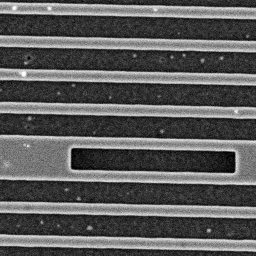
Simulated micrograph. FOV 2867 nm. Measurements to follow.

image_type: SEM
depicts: groups of lines, slits or small figures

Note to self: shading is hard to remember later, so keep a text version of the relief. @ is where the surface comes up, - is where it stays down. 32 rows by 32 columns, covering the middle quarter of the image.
--------------------------------
--------------------------------
@@@@@@@@@@@@@@@@@@@@@@@@@@@@@@@@
@@@@@@@@@@@@@@@@@@@@@@@@@@@@@@@@
-------------@@@@@@@@@@@@@@@@@@@
--------------------------------
--------------------------------
--------------------------------
--------------------------------
--------------------------------
@@@@@@@@@@@@@@@@@@@@@@@@@@@@----
@@@@@@@@@@@@@@@@@@@@@@@@@@@@@@@@
------@@@@@@@@@@@@@@@@@@@@@@@@@@
--------------------------------
--------------------------------
--------------------------------
--------------------------------
--------------------------------
@@@@@@@@@-----------------------
@@@@@@@@@@@@@@@@@@@@@@@@@@@@@@@@
@@@@@@@@@@@@@@@@@@@@@@@@@@@@@@@@
@@------------------------------
@@------------------------------
@@------------------------------
@@------------------------------
@@------------------------------
@@@-----------------------------
@@@@@@@@@@@@@@@@@@@@@@@@@@@@@@@@
@@@@@@@@@@@@@@@@@@@@@@@@@@@@@@@@
-------------------@@@@@@@@@@@@@
--------------------------------
--------------------------------